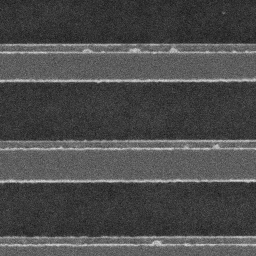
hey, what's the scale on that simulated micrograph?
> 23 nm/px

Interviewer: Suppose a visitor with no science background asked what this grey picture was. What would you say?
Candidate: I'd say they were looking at lines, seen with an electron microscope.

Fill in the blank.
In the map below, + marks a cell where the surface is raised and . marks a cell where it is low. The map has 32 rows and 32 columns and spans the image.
................................
................................
................................
................................
................................
................................
++++++++++++++++++++++++++++++++
++++++++++++++++++++++++++++++++
++++++++++++++++++++++++++++++++
++++++++++++++++++++++++++++++++
................................
................................
................................
................................
................................
................................
................................
................................
++++++++++++++++++++++++++++++++
++++++++++++++++++++++++++++++++
++++++++++++++++++++++++++++++++
++++++++++++++++++++++++++++++++
++++++++++++++++++++++++++++++++
................................
................................
................................
................................
................................
................................
................................
++++++++++++++++++++++++++++++++
++++++++++++++++++++++++++++++++